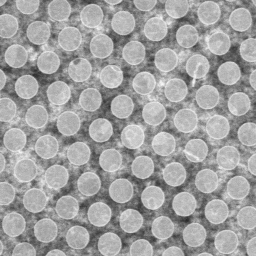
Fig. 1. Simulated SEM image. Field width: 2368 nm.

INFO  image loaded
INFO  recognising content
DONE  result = a regular array of raised bodies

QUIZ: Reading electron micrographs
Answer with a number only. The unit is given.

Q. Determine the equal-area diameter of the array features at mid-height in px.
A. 23.2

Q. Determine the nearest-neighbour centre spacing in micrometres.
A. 0.293